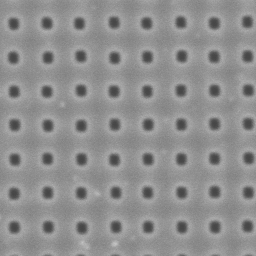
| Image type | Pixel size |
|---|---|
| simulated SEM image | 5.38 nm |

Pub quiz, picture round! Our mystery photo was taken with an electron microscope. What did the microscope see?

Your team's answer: a regular array of holes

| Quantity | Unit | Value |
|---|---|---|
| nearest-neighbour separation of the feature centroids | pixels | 33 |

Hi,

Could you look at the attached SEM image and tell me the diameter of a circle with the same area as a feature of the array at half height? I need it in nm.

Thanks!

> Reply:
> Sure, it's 67.7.